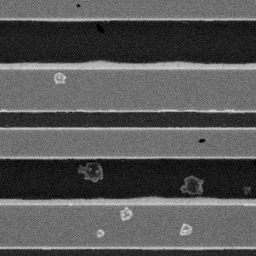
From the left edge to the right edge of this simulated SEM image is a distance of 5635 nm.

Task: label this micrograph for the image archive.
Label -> lines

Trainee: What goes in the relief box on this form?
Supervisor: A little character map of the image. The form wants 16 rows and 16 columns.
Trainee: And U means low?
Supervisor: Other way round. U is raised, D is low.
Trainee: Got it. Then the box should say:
UUUUUUUUUUUUUUUU
DDDDDDDDDDDDDDDD
DDDDDDDDDDDDDDDD
DDDDDDDDDDDDDDDD
UUUUUUUUUUUUUUUU
UUUUUUUUUUUUUUUU
UUUUUUUUUUUUUUUU
UUUUUUUUUUUUUUUU
UUUUUUUUUUUUUUUU
UUUUUUUUUUUUUUUU
DDDDDDDDDDDDDDDD
DDDDDDDDDDDDDDDD
DDDDDDDDDDDDDDDD
UUUUUUUUUUUUUUUU
UUUUUUUUUUUUUUUU
UUUUUUUUUUUUUUUU